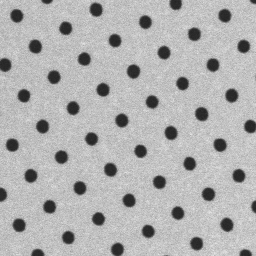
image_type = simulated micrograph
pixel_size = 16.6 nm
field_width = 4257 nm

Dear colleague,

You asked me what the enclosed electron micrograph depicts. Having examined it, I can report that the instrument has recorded a regular array of holes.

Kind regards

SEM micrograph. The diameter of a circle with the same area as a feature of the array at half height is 226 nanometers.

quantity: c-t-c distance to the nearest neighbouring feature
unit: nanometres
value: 589